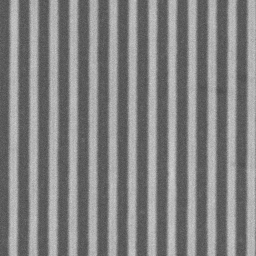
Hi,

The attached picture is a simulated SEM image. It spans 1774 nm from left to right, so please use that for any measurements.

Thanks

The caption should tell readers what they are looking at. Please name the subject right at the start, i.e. parallel lines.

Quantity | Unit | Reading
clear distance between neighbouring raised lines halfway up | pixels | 13.1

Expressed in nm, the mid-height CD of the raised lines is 48.5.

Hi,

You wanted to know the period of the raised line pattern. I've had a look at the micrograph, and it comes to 137 nm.